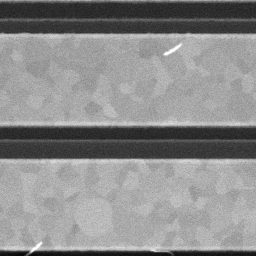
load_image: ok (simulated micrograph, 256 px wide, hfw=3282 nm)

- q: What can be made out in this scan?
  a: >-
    lines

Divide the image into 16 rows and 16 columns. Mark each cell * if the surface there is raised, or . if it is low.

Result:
................
................
****************
****************
****************
****************
****************
****************
................
................
****************
****************
****************
****************
****************
****************